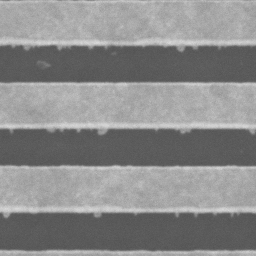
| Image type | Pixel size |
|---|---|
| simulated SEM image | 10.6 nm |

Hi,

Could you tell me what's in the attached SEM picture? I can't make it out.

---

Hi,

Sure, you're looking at lines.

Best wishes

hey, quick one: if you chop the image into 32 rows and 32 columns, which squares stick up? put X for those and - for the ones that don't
XXXXXXXXXXXXXXXXXXXXXXXXXXXXXXXX
XXXXXXXXXXXXXXXXXXXXXXXXXXXXXXXX
XXXXXXXXXXXXXXXXXXXXXXXXXXXXXXXX
XXXXXXXXXXXXXXXXXXXXXXXXXXXXXXXX
XXXXXXXXXXXXXXXXXXXXXXXXXXXXXXXX
--XXXXXXXXXXXXXXXXX-XXXXXXXXXXXX
--------------------------------
--------------------------------
--------------------------------
--------------------------------
XXXXXXXXXXXXXXXXXXXXXXXXXXXXXXXX
XXXXXXXXXXXXXXXXXXXXXXXXXXXXXXXX
XXXXXXXXXXXXXXXXXXXXXXXXXXXXXXXX
XXXXXXXXXXXXXXXXXXXXXXXXXXXXXXXX
XXXXXXXXXXXXXXXXXXXXXXXXXXXXXXXX
XXXXXXXXXXXXXXXXXXXXXXXXXXXXXXXX
--------------------------------
--------------------------------
--------------------------------
--------------------------------
--------------------------------
XXXXXXXXXXXXXXXXXXXXXXXXXXXXXXXX
XXXXXXXXXXXXXXXXXXXXXXXXXXXXXXXX
XXXXXXXXXXXXXXXXXXXXXXXXXXXXXXXX
XXXXXXXXXXXXXXXXXXXXXXXXXXXXXXXX
XXXXXXXXXXXXXXXXXXXXXXXXXXXXXXXX
---XX-----XX--XXXXXXXXX-XXXXX--X
--------------------------------
--------------------------------
--------------------------------
--------------------------------
XXXXXXXXXXXXXXXXXXXXXXXXXXXXXXXX